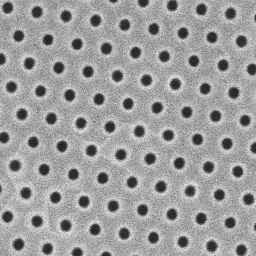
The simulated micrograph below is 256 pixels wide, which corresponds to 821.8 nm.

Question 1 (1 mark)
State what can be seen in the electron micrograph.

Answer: a regular array of holes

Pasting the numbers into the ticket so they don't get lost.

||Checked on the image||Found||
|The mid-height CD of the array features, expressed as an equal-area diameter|35.9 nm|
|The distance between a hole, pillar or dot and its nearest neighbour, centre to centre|94.2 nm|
